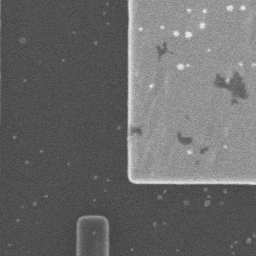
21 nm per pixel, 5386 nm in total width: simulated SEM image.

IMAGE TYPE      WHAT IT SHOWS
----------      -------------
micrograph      wiring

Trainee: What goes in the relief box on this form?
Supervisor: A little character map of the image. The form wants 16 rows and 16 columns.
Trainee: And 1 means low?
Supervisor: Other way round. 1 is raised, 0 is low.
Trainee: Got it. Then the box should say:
0000000011111111
0000000011111111
0000000011111111
0000000011111111
0000000011111111
0000000011111111
0000000011111111
0000000011111111
0000000011111111
0000000011111111
0000000011111111
0000000000000000
0000000000000000
0000000000000000
0000011000000000
0000011000000000